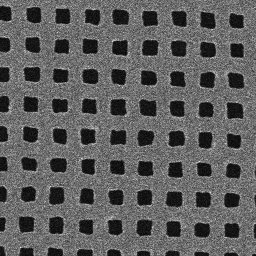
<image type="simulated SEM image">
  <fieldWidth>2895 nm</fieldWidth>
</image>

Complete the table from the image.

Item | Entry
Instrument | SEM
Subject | a regular array of holes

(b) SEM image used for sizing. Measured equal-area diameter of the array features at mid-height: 16.6 px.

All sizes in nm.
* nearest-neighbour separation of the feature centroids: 325